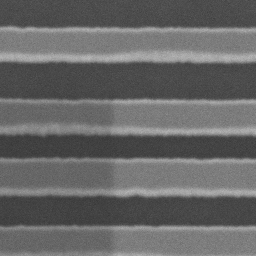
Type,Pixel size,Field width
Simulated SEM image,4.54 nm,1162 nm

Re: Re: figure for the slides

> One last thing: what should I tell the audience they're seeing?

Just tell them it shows lines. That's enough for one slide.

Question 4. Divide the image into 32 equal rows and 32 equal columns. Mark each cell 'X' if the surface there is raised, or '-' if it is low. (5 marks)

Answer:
--------------------------------
--------------------------------
--------------------------------
XX-XXX--XXXXXXX--XXX-XX--------X
XXXXXXXXXXXXXXXXXXXXXXXXXXXXXXXX
XXXXXXXXXXXXXXXXXXXXXXXXXXXXXXXX
XXXXXXXXXXXXXXXXXXXXXXXXXXXXXXXX
X-XXXXXXXXXXXXXXX--XXXX-XXXXXXXX
--------------------------------
--------------------------------
--------------------------------
--------------------------------
XXX---------------X-------------
XXXXXXXXXXXXXXXXXXXXXXXXXXXXXXXX
XXXXXXXXXXXXXXXXXXXXXXXXXXXXXXXX
XXXXXXXXXXXXXXXXXXXXXXXXXXXXXXXX
XXXXXXXXXXXXXXXXXXXXXXXXXXXXXXXX
--------------------------------
--------------------------------
--------------------------------
XXXXXXXXXXXXXXXXXXXXXXXXXXXXXXXX
XXXXXXXXXXXXXXXXXXXXXXXXXXXXXXXX
XXXXXXXXXXXXXXXXXXXXXXXXXXXXXXXX
XXXXXXXXXXXXXXXXXXXXXXXXXXXXXXXX
--------------------------------
--------------------------------
--------------------------------
--------------------------------
XXXXXXXXXXXXXXXXXXXXXXXXXXXXXXXX
XXXXXXXXXXXXXXXXXXXXXXXXXXXXXXXX
XXXXXXXXXXXXXXXXXXXXXXXXXXXXXXXX
XXXXXXXXXXXXXXXXXXXXXXXXXXXXXXXX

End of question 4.